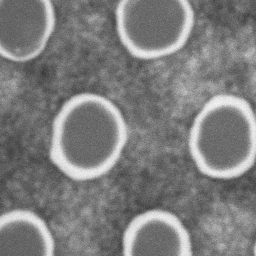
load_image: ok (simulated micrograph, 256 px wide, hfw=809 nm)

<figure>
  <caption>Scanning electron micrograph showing raised bodies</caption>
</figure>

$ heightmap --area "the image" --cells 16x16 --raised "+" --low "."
+++....+++++....
+++....+++++....
+++.....+++.....
++..............
................
................
....+++......++.
....++++....++++
....++++....++++
....+++.....++++
....+++......++.
................
................
.+.......+......
+++.....+++.....
+++.....++++....